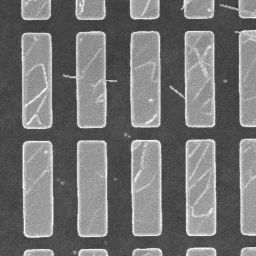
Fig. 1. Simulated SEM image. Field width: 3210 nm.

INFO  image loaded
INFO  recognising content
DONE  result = wiring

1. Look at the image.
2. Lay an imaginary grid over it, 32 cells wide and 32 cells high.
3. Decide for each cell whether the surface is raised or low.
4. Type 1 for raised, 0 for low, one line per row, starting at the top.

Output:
00011100001110001111000111100011
00011100001110001111000111100011
00000000000000000000000000000000
00000000000000000000000000000000
00011100001110001111000111100011
00011100001110001111000111100011
00011100001110001111000111100011
00011100001110001111000111100011
00011100001110001111000111100011
00011100011110001111000111100011
00011100001110001111000111100011
00011100001110001111000111100011
00011100001110001111000111100011
00011100001110001111000111100011
00011100001110001111000111100011
00011100001110000111000111100011
00000000000000000000000000000000
00000000000000000000000000000001
00011110001110001111000111100011
00011110001110000111000111100011
00011110001110000111000111100011
00011110001110000111000111100011
00011110001110000111000111100011
00011110001110000111000111100011
00011110001110000111000111100011
00011110001110000111000111100011
00011110001110000111000111100011
00011110001110000111000111100011
00011110001110000111000111100011
00011100001110000000000000000000
00000000000000000000000000000000
00011110001110000111000111100011